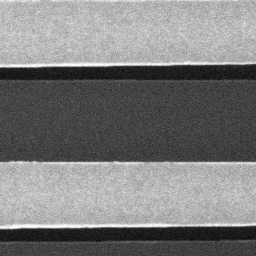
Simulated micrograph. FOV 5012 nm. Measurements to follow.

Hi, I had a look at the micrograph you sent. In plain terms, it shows lines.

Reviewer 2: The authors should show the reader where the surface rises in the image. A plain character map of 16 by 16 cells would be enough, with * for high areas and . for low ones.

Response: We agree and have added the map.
****************
****************
****************
****************
................
................
................
................
................
................
****************
****************
****************
****************
................
................